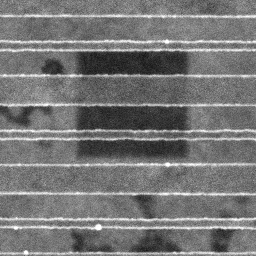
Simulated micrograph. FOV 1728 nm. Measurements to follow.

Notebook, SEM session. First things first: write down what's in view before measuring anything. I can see lines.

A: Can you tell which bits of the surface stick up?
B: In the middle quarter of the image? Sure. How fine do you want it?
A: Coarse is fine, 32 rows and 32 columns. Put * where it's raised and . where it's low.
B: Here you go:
................................
................................
................................
********************************
********************************
********************************
********************************
********************************
********************************
********************************
................................
................................
................................
................................
................................
................................
........**......................
********************************
********************************
................................
................................
................................
................................
................................
................................
********************************
********************************
********************************
********************************
********************************
********************************
********************************